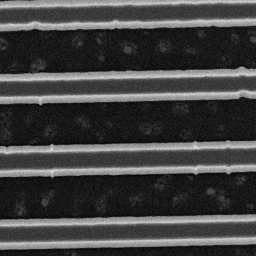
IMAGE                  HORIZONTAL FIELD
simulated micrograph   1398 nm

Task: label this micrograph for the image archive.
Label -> one or a few lines or trenches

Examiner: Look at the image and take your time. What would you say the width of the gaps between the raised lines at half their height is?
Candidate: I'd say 266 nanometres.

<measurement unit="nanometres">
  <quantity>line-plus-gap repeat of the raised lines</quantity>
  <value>398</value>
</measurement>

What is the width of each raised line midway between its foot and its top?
130 nm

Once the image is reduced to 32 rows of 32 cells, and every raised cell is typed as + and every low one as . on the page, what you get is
.....+++++++++++++++++++++++++++
++++++++++++++++++++++++++++++++
++++++++++++++++++++++++++++++++
................................
................................
................................
................................
................................
................................
.........+.+++++++++++++++++++++
++++++++++++++++++++++++++++++++
++++++++++++++++++++++++++++++++
++..++..........................
................................
................................
................................
................................
................................
..........++++++++++++++++++++++
++++++++++++++++++++++++++++++++
++++++++++++++++++++++++++++++++
++++++++++......................
................................
................................
................................
................................
................................
...................+++++++++++++
++++++++++++++++++++++++++++++++
++++++++++++++++++++++++++++++++
+++++++++++++...................
................................